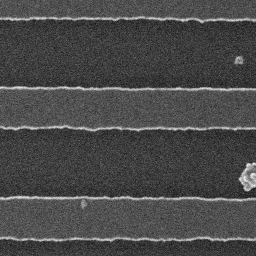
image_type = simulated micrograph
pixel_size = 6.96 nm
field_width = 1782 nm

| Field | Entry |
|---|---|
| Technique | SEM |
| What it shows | lines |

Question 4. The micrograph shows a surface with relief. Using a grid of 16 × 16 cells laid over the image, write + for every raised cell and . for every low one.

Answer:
++++++++++++++++
................
................
................
................
++..+...........
++++++++++++++++
++++++++++++++++
................
................
................
................
++++++++++++++++
++++++++++++++++
++++++++++++++++
................